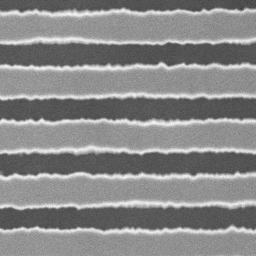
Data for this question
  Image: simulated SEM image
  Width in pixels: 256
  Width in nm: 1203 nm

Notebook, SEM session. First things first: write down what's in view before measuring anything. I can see lines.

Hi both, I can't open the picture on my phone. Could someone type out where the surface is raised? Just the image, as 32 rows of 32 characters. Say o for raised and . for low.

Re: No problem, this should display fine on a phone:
................................
.o.oo.......ooooo.oooooo.ooooooo
oooooooooooooooooooooooooooooooo
oooooooooooooooooooooooooooooooo
oooooooooooooooooooooooooooooooo
.o.............o...o............
................................
................................
oooooooooooooooooooooooooooooooo
oooooooooooooooooooooooooooooooo
oooooooooooooooooooooooooooooooo
oooooooooooooooooooooooooooooooo
................................
................................
................................
oooooooooooooooooooooooooooooooo
oooooooooooooooooooooooooooooooo
oooooooooooooooooooooooooooooooo
oooooooooooooooooooooooooooooooo
................................
................................
................................
oooooooooooooooooooooooooooooooo
oooooooooooooooooooooooooooooooo
oooooooooooooooooooooooooooooooo
oooooooooooooooooooooooooooooooo
................................
................................
.............................o..
oooooooooooooooooooooooooooooooo
oooooooooooooooooooooooooooooooo
oooooooooooooooooooooooooooooooo